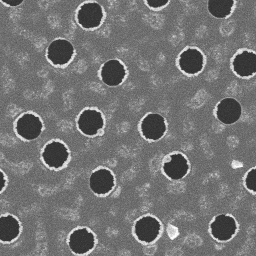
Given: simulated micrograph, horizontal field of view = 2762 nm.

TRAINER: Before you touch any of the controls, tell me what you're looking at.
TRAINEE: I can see a regular array of holes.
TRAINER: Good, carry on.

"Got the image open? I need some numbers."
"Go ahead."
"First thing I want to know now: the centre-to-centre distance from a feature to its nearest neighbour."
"549 nm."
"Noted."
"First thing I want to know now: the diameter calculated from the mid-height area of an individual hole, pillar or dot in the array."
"275 nanometers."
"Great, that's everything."